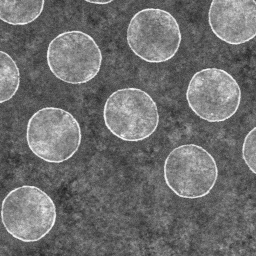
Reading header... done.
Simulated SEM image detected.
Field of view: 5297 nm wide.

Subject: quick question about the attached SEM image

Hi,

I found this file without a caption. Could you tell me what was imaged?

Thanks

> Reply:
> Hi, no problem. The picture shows raised bodies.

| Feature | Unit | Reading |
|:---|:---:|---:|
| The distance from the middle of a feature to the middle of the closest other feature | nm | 1650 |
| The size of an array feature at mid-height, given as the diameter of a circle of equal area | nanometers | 1080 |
